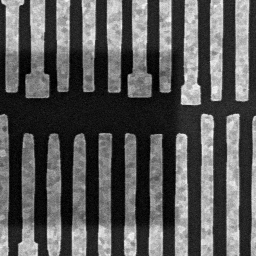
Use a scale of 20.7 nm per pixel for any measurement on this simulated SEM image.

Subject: wiring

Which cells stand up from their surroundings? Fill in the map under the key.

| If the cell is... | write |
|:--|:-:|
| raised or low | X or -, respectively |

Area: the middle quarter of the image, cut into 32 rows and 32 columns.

X----XX----XXX---XXXX---XXX---XX
X----XX----XXX---XXXX---XXX---XX
X----XX----XXX---XXXX---XXX---XX
X----XX----XXX--XXXXXX--XX----XX
X----XX----XXX--XXXXXX--XX----XX
X----XX----XXX--XXXXXX--XX----XX
X----XX----XXX--XXXXXX--XX---XXX
----------------XXXXXX-------XXX
-----------------------------XXX
-----------------------------XXX
--------------------------------
--------------------------------
--------------------------------
--------------------------------
--------------------------------
--------------------------------
--------------------------------
----X----XXX----X---------------
---XX----XXX---XXX----XX----XXX-
---XX----XXX---XXX----XX----XXX-
---XX----XXX---XXX----XX----XXX-
---XX----XXX---XXX----XX----XXX-
---XX----XXX---XXX----XX----XXX-
---XX----XXX---XXX----XX----XXX-
---XX----XXX---XXX----XX----XXX-
--XXX----XXX---XXX----XX----XXX-
--XXX----XXX---XXX----XX----XXX-
--XXX----XXX---XXX----XX----XXX-
--XXX----XXX---XXX----XX----XXX-
--XXX----XXX---XXX----XX----XXX-
--XXX----XXX---XXX----XX----XXX-
--XXX----XXX---XXX----XX----XXX-